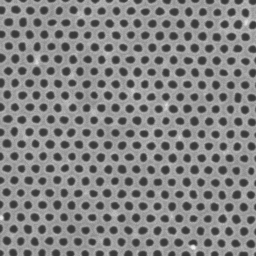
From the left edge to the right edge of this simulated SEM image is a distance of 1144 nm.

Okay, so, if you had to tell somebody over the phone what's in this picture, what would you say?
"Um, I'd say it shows a regular array of holes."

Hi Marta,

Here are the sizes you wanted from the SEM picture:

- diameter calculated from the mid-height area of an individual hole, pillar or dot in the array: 0.0364 µm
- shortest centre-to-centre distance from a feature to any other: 61.2 nanometers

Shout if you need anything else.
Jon